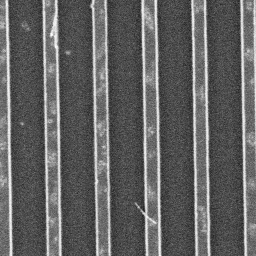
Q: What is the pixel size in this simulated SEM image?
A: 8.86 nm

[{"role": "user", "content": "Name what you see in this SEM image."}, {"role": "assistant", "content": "parallel lines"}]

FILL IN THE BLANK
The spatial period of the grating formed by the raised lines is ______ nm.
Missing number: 439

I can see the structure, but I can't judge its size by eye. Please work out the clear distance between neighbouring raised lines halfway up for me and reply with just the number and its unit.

0.322 um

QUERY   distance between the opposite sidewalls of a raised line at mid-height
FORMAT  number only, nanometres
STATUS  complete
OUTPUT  113